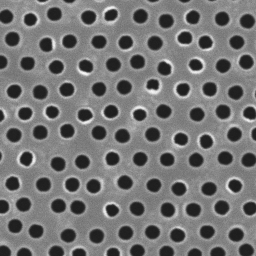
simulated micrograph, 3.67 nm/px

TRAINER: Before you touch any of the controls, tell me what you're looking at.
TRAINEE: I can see a regular array of holes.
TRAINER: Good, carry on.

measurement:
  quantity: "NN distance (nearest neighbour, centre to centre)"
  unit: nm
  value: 89.4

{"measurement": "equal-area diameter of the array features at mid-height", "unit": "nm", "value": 51.9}